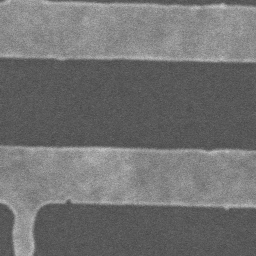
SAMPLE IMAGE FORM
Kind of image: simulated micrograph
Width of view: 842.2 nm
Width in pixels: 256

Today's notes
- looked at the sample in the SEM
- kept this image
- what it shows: one or a few lines or trenches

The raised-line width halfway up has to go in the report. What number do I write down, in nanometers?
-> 176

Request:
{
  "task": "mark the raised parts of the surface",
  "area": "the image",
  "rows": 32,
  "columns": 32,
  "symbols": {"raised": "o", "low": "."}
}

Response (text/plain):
ooooooooo.......................
oooooooooooooooooooooooooooooooo
oooooooooooooooooooooooooooooooo
oooooooooooooooooooooooooooooooo
oooooooooooooooooooooooooooooooo
oooooooooooooooooooooooooooooooo
oooooooooooooooooooooooooooooooo
.........................ooooooo
................................
................................
................................
................................
................................
................................
................................
................................
................................
................................
ooo.............................
oooooooooooooooooooooooooooooooo
oooooooooooooooooooooooooooooooo
oooooooooooooooooooooooooooooooo
oooooooooooooooooooooooooooooooo
oooooooooooooooooooooooooooooooo
oooooooooooooooooooooooooooooooo
.ooooo.............o..oooooooooo
..oo............................
..oo............................
..oo............................
..oo............................
..oo............................
..oo............................